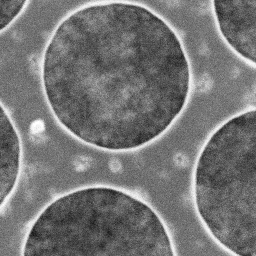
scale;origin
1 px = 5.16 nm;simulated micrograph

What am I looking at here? holes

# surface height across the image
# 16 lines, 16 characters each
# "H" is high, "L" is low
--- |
LHHHHLLLLHHHHLLL
LHHHLLLLLLHHHHLL
HHHLLLLLLLLHHHLL
HHHLLLLLLLLLHHHL
HHHLLLLLLLLLHHHH
HHHLLLLLLLLLHHHH
HHHLLLLLLLLHHHHH
LHHHLLLLLLLHHHLL
LHHHHLLLLLHHHLLL
LHHHHHHHHHHHHLLL
LHHHHHHHHHHHLLLL
LHHHHHHHHHHHLLLL
HHHHLLLLLHHHLLLL
HHHLLLLLLLHHHLLL
HHLLLLLLLLHHHLLL
HHLLLLLLLLLHHHLL